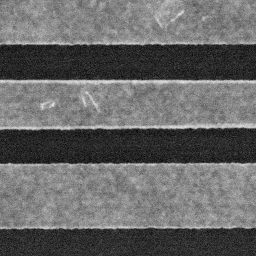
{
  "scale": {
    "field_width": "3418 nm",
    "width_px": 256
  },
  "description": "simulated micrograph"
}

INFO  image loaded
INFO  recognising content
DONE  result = lines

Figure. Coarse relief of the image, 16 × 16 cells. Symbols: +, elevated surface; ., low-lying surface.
++++++++++++++++
++++++++++++++++
++++++++++++++++
................
................
++++++++++++++++
++++++++++++++++
++++++++++++++++
................
................
++++++++++++++++
++++++++++++++++
++++++++++++++++
++++++++++++++++
................
................